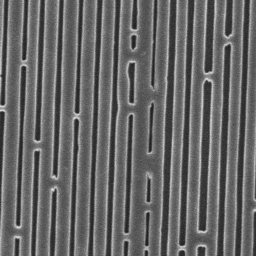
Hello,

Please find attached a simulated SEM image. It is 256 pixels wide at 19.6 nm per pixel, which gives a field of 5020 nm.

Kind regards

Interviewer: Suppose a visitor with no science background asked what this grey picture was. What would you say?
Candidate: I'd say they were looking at parallel lines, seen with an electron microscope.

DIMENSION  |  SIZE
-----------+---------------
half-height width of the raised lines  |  238 nm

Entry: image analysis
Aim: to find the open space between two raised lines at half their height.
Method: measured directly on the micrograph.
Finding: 120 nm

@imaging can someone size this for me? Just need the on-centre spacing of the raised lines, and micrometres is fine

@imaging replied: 0.362